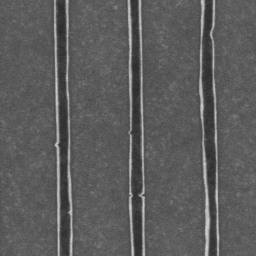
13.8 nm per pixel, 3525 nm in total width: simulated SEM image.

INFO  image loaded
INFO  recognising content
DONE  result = one or a few lines or trenches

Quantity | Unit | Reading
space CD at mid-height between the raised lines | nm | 852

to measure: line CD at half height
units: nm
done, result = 165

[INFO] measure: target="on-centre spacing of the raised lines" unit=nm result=1010